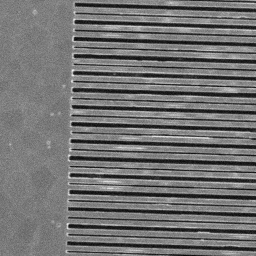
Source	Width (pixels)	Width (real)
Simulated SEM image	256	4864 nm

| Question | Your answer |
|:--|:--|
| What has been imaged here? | parallel lines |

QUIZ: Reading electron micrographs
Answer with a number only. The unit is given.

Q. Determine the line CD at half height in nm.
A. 99.7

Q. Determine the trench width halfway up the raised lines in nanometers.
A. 85.5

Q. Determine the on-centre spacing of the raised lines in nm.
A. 162